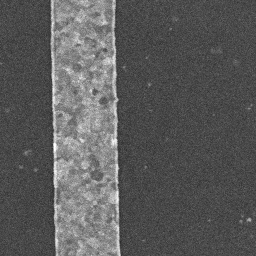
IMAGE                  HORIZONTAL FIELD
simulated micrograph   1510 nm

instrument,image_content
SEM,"one or a few lines or trenches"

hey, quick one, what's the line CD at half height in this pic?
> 62.1 pixels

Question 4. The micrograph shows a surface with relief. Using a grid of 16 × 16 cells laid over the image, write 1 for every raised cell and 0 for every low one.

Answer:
0001111000000000
0001111000000000
0001111000000000
0001111000000000
0001111000000000
0001111000000000
0001111000000000
0001111000000000
0001111000000000
0001111000000000
0001111000000000
0001111000000000
0001111000000000
0001111000000000
0000111000000000
0000111000000000